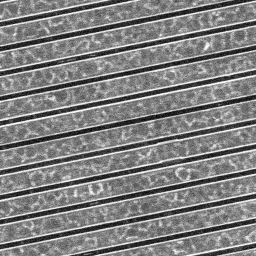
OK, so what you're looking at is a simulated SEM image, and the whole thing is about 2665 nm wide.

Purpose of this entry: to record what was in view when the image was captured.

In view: parallel lines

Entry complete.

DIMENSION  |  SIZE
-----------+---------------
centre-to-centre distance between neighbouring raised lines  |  252 nanometres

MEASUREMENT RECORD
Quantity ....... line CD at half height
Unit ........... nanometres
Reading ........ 195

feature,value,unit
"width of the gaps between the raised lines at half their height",52.3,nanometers